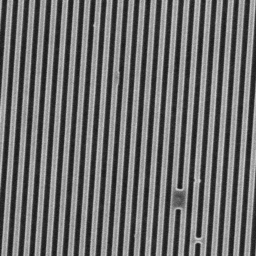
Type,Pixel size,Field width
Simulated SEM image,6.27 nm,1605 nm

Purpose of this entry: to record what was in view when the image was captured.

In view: parallel lines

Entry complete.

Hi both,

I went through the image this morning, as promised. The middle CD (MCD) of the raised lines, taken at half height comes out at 30.5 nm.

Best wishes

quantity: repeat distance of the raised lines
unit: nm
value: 69.1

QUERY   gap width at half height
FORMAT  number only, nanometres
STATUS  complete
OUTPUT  36.8